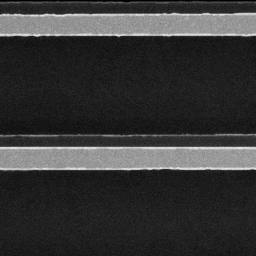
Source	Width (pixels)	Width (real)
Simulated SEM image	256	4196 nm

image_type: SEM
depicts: lines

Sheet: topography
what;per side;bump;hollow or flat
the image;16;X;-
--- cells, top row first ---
XXXXXXXXXXXXXXXX
XXXXXXXXXXXXXXXX
----------------
----------------
----------------
----------------
----------------
----------------
XXXXXXX-XXXXXXXX
XXXXXXXXXXXXXXXX
XXXXXXXXXXXXXXXX
----------------
----------------
----------------
----------------
----------------